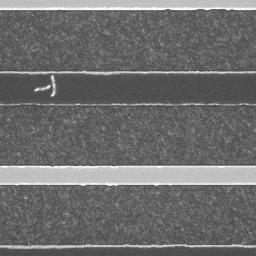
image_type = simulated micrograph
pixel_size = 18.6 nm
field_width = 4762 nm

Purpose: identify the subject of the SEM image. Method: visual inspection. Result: lines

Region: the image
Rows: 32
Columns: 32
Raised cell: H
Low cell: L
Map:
HHHHHHHHHHHHHHHHHHHHHHHHHHHHHHHH
LLLLLLLLLLLLLLLLLLLLLLLLLLLLLLLL
LLLLLLLLLLLLLLLLLLLLLLLLLLLLLLLL
LLLLLLLLLLLLLLLLLLLLLLLLLLLLLLLL
LLLLLLLLLLLLLLLLLLLLLLLLLLLLLLLL
LLLLLLLLLLLLLLLLLLLLLLLLLLLLLLLL
LLLLLLLLLLLLLLLLLLLLLLLLLLLLLLLL
LLLLLLLLLLLLLLLLLLLLLLLLLLLLLLLL
LLLLLLLLLLLLLLLLLLLLLLLLLLLLLLLL
HHHHHHHHHHHHHHHHHHHHHHHHHHHHHHHH
HHHHHHHHHHHHHHHHHHHHHHHHHHHHHHHH
HHHHHHHHHHHHHHHHHHHHHHHHHHHHHHHH
HHHHHHHHHHHHHHHHHHHHHHHHHHHHHHHH
LLLLLLLLLLLLLLLLLLLLLLLLLLLLLLLL
LLLLLLLLLLLLLLLLLLLLLLLLLLLLLLLL
LLLLLLLLLLLLLLLLLLLLLLLLLLLLLLLL
LLLLLLLLLLLLLLLLLLLLLLLLLLLLLLLL
LLLLLLLLLLLLLLLLLLLLLLLLLLLLLLLL
LLLLLLLLLLLLLLLLLLLLLLLLLLLLLLLL
LLLLLLLLLLLLLLLLLLLLLLLLLLLLLLLL
LLLLLLLLLLLLLLLLLLLLLLLLLLLLLLLL
HHHHHHHHHHHHHHHHHHHHHHHHHHHHHHHH
HHHHHHHHHHHHHHHHHHHHHHHHHHHHHHHH
LLLLLLLLLLLLLLLLLLLLLLLLLLLLLLLL
LLLLLLLLLLLLLLLLLLLLLLLLLLLLLLLL
LLLLLLLLLLLLLLLLLLLLLLLLLLLLLLLL
LLLLLLLLLLLLLLLLLLLLLLLLLLLLLLLL
LLLLLLLLLLLLLLLLLLLLLLLLLLLLLLLL
LLLLLLLLLLLLLLLLLLLLLLLLLLLLLLLL
LLLLLLLLLLLLLLLLLLLLLLLLLLLLLLLL
LLLLLLLLLLLLLLLLLLLLLLLLLLLLLLLL
HHHHHHHHHHHHHHHHHHHHHHHHHHHHHHHH